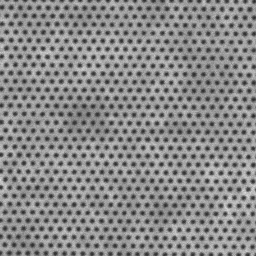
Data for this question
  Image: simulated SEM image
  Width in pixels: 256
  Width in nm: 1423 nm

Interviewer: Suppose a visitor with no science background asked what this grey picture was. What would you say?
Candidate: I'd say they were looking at a regular array of holes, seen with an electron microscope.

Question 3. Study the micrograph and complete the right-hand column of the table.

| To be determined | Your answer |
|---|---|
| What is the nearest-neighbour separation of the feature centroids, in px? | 8.88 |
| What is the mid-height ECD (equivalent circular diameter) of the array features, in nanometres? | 26.6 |